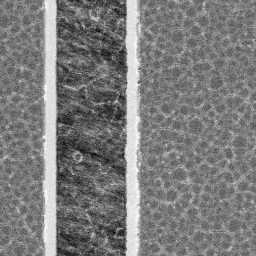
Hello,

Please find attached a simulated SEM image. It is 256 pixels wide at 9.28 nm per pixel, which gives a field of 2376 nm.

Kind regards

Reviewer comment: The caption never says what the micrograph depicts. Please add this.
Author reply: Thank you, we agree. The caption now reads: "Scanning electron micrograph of one or a few lines or trenches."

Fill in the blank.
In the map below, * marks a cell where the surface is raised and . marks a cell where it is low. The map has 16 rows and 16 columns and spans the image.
***.....********
***.....********
***.....********
***.....********
***.....********
***.....********
***.....********
***.....********
***.....********
***.....********
***.....********
***.....********
***.....********
***.....********
***.....********
***.....********